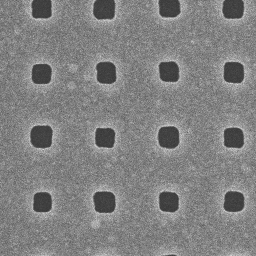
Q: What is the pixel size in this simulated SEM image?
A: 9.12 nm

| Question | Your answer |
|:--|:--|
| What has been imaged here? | a regular array of holes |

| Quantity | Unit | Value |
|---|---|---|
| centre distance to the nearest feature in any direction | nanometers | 577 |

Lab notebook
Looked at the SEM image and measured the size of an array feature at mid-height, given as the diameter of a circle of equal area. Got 200 nm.